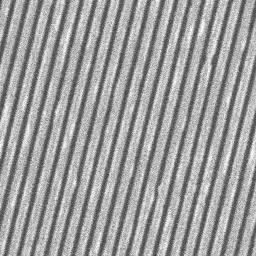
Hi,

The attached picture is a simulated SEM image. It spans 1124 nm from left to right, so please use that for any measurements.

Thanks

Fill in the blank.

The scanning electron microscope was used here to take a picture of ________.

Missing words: parallel lines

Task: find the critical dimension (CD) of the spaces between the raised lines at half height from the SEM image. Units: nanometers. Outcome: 22.9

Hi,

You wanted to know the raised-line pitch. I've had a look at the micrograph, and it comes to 57.8 nanometers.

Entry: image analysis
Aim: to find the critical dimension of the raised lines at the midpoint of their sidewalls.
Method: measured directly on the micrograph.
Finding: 0.0346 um